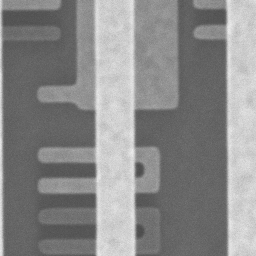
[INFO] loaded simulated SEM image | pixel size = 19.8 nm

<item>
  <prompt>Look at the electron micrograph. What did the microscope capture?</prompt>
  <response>wiring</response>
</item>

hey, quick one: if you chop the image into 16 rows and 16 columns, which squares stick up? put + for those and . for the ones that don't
......++......++
......++......++
......++......++
......++......++
......++......++
......++......++
......++......++
......++......++
......++......++
......++......++
......++......++
......++......++
......++......++
......++......++
......++......++
......++......++